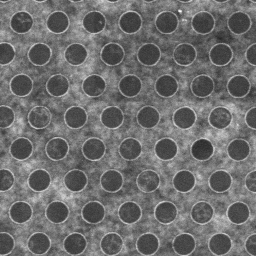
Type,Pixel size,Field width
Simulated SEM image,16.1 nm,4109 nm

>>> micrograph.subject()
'a regular array of raised bodies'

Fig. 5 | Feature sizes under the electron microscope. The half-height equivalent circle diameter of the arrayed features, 0.37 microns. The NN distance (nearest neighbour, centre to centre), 579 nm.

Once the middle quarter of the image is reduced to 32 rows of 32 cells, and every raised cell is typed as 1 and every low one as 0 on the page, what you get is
00000000000000000000000000000000
00000000000000000000000000000000
00000000000000000000000000000000
10000011100000011110000011110000
10000111110000111110000111110000
10000111110000111110000111111000
10000111110000111110000111110000
00000111100000011110000011110000
00000000000000000000000000000000
00000000000000000000000000000000
00000000000000000000110000000000
01111000001111000001111000001111
11111100011111100011111100011111
11111100011111100011111100011111
11111000011111100011111100011111
01111000001111000001111000001111
00000000000000000000000000000000
00000000000000000000000000000000
00000000000000001100000000000000
10000111110000011110000111110000
10000111110000111110000111110000
10000111110000111110000111110000
10000111110000111110000111110000
00000011100000011100000011100000
00000000000000000000000000000000
00000000000000000000000000000000
00110000000110000000010000000000
01111000001111000001111000001111
11111100011111100011111100011111
11111100011111100011111100011111
11111000011111000011111100011111
01111000001111000001111000001111